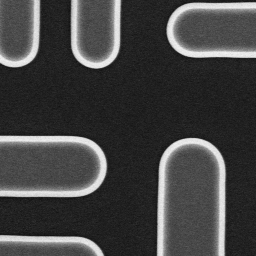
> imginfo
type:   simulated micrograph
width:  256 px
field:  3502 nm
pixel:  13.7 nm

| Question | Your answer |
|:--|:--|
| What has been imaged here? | groups of lines, slits or small figures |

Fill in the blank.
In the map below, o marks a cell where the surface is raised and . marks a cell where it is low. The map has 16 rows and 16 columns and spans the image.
oo...oo....ooooo
oo...oo....ooooo
oo...oo....ooooo
oo...oo.........
................
................
................
................
................
oooooo.....oo...
oooooo....oooo..
oooooo....oooo..
..........oooo..
..........oooo..
..........oooo..
oooooo....oooo..